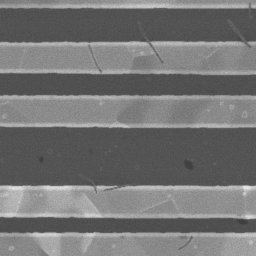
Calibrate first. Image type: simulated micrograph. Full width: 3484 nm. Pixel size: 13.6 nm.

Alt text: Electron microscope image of lines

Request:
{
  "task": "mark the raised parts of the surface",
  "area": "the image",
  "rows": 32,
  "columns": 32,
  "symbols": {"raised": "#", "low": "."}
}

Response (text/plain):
################################
................................
................................
................................
................................
################################
################################
################################
################################
................................
................................
................................
################################
################################
################################
################################
................................
................................
................................
................................
................................
................................
................................
################################
################################
################################
################################
................................
................................
################################
################################
################################